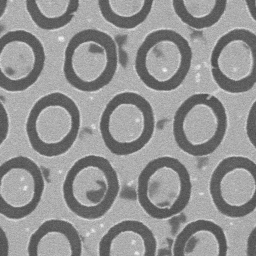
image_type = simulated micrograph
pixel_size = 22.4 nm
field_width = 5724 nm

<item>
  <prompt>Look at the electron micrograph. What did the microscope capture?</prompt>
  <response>ring-shaped grooves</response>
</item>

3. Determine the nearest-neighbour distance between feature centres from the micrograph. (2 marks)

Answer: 1620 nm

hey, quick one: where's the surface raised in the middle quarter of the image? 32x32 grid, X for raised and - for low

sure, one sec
--XXXXXXXX---XXXXX---XXXXXXXX---
--XXXXXXXX---XXXXX---XXXXXXX---X
---XXXXXX----XXXXX----XXXXXX---X
----XXXX----XXXXXXX----XXX----XX
X----------XXXXXXXXX----------XX
XX--------XXXXXXXXXXX--------XXX
XXXX-----XXXXXXXXXXXXXX----XXXXX
XXXXXXXXXXXXXX----XXXXXXXXXXXXXX
-XXXXXXXXXXX--------XXXXXXXXXXX-
---XXXXXXXX----------XXXXXXXXX--
---XXXXXXX----XXXX----XXXXXXX---
X---XXXXXX---XXXXXX---XXXXXX----
X---XXXXX---XXXXXXX---XXXXXX---X
XX--XXXXX---XXXXXXXX--XXXXX---XX
XX--XXXXX--XXXXXXXXX---XXXX---XX
XX--XXXXX--XXXXXXXXX---XXXX---XX
XX--XXXXX--XXXXXXXXX---XXXX---XX
X---XXXXX---XXXXXXX---XXXXX---XX
---XXXXXXX--XXXXXXX---XXXXXX---X
---XXXXXXX-----------XXXXXXX---X
--XXXXXXXXX---------XXXXXXXXX---
-XXXXXXXXXX--------XXXXXXXXXX---
XXXXXXXXXXXX-----XXXXXXXXXXXXXX-
XXXX------XXXXXXXXXXXXXX---XXXXX
XXX--------XXXXXXXXXX--------XXX
XX----------XXXXXXXX----------XX
X---XXXXX----XXXXXXX---XXXX----X
X--XXXXXXX---XXXXXX---XXXXXX---X
---XXXXXXX---XXXXXX--XXXXXXXX--X
--XXXXXXXXX---XXXX---XXXXXXXX---
--XXXXXXXXX---XXXX---XXXXXXXX---
--XXXXXXXXX---XXXX---XXXXXXXX---